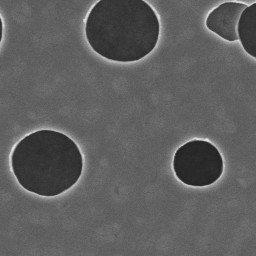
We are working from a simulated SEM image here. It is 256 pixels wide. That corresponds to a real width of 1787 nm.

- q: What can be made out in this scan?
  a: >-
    holes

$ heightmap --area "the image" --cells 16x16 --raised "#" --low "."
######...######.
#####.....#####.
#####.....#####.
#######..#######
################
################
################
################
##..############
#....######...##
#....######...##
#....#######.###
################
################
################
################